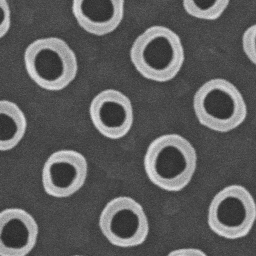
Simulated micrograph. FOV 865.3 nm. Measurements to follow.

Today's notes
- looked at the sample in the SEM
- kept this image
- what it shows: ring-shaped raised bodies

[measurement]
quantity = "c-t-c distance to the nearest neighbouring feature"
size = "252 nanometers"